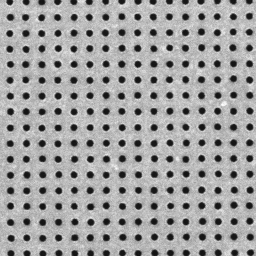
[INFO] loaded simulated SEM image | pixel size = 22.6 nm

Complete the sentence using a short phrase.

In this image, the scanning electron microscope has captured a regular array of holes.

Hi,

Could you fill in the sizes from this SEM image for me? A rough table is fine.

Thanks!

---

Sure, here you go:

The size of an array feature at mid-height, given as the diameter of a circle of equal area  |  163 nm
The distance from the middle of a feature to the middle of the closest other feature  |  349 nm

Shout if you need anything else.